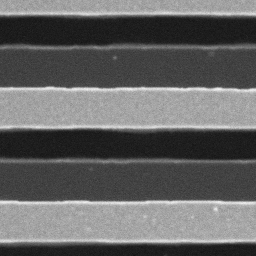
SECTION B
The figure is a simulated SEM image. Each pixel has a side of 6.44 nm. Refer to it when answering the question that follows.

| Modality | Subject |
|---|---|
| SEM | lines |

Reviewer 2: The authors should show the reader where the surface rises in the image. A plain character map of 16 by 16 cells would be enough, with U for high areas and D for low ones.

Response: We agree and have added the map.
UUUUUUUUUUUUUUUU
DDDDDDDDDDDDDDDD
DDDDDDDDDDDDDDDD
UUUUUUUUUUUUUUUU
UUUUUUUUUUUUUUUU
UUUUUUUUUUUUUUUU
UUUUUUUUUUUUUUUU
UUUUUUUUUUUUUUUU
DDDDDDDDDDDDDDDD
DDDDDDDDDDDDDDDD
UUUUUUUUUUUUUUUU
UUUUUUUUUUUUUUUU
UUUUUUUUUUUUUUUU
UUUUUUUUUUUUUUUU
UUUUUUUUUUUUUUUU
DDDDDDDDDDDDDDDD